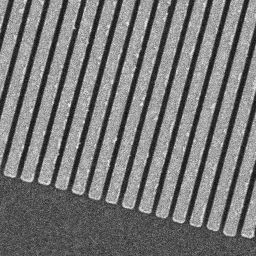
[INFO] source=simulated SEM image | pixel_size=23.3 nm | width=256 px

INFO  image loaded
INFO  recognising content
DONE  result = parallel lines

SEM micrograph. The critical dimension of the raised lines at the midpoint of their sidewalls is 276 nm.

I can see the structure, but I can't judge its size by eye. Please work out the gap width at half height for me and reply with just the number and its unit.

0.138 um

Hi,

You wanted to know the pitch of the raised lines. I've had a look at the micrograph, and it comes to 405 nm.